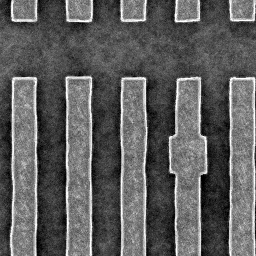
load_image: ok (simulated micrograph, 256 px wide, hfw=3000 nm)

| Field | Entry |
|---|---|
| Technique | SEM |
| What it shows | wiring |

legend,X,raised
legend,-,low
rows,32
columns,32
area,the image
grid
--XXX---XXX----XXX----XXX----XXX
--XXX---XXX----XXX----XXX----XXX
--XX-----XX----XXX----XXX----XXX
--------------------------------
--------------------------------
--------------------------------
--------------------------------
--------------------------------
--------------------------------
--------------------------------
--XX----XXX----XXX----XXX----XXX
--XX----XXX----XXX----XXX----XXX
--XX----XXX----XXX----XXX----XXX
--XX----XXX----XXX----XXX----XXX
--XX----XXX----XXX----XXX----XXX
--XXX---XXX----XXX----XXX----XXX
--XXX---XXX----XXX----XXX----XXX
--XXX---XXX----XXX---XXXXX---XXX
--XX----XXX----XXX---XXXXX---XXX
--XX----XXX----XXX---XXXXX---XXX
--XXX---XXX----XXX---XXXXX---XXX
--XXX---XXX----XXX----XXXX---XXX
--XXX---XXX----XXX----XXX----XXX
--XX----XXX----XXX----XXX----XXX
--XXX---XXX----XXX----XXX----XXX
--XXX---XXX----XXX----XXX----XXX
--XXX---XXX----XXX----XXX----XXX
--XXX---XXX----XXX----XXX----XXX
-XXX----XXX----XXX----XXX----XXX
-XXX----XXX----XXX----XXX----XXX
-XXX----XXX----XXX----XXX----XXX
-XXX----XXX----XXX----XXX----XXX